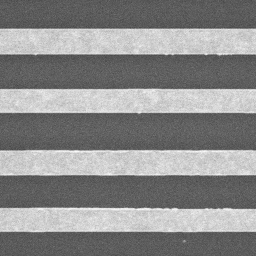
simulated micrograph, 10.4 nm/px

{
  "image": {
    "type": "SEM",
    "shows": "lines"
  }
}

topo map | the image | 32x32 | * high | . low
................................
................................
................................
................................
********************************
********************************
********************************
................................
................................
................................
................................
********************************
********************************
********************************
................................
................................
................................
................................
................................
********************************
********************************
********************************
................................
................................
................................
................................
********************************
********************************
********************************
................................
................................
................................